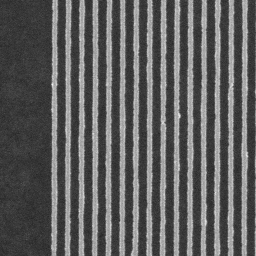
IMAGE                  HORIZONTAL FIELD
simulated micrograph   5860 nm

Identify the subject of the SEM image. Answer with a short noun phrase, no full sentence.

parallel lines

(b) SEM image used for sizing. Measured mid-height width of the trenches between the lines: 212 nanometres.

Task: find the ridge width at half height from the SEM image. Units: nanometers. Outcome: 100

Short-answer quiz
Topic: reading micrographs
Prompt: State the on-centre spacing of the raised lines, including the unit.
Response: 311 nm